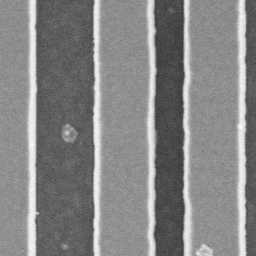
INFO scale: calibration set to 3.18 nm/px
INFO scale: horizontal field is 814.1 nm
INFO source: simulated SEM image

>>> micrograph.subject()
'lines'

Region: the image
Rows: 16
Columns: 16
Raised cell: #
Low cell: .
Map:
##....####..###.
##....####..###.
##....####..###.
##....####..###.
##....####..###.
##....####.####.
##....####.####.
##....####.####.
##....####..###.
##....####..###.
##....####..###.
##....####.####.
##....####..###.
##....####..###.
##....####..###.
##....####..###.